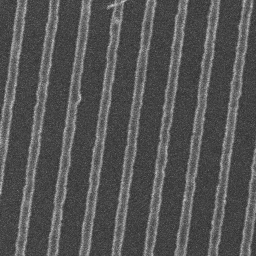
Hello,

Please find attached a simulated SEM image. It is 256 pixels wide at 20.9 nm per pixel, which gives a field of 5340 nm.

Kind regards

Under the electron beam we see parallel lines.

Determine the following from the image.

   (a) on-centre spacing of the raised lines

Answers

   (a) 666 nm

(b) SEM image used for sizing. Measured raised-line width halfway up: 0.181 um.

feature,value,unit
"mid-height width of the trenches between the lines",22.9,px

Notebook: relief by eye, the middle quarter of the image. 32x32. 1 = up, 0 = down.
00111000000110000011100000011000
00111000001100000011000000011000
00110000001100000011000000110000
00110000001100000011000000110000
00110000001100000011000000110000
00110000001100000011000000110000
01110000001100000011000000110000
00110000001100000011000001110000
01110000011100000110000001110000
01110000011100000110000001100000
01100000011000000110000001100000
01100000011000000110000001100000
01100000011000000110000001100000
01100000011000000110000001100000
11100000011000001110000001100000
11100000110000001100000001100000
11100000110000001100000011000000
11000000110000001100000011000000
11000000110000001100000011000000
11000000110000001100000011000000
11000000110000001100000011000000
11000001110000001100000011000000
10000001100000011100000111000000
10000001100000011100000111000001
10000001100000011000000111000001
10000001100000011000000110000001
10000001100000011000000110000001
10000001100000011000000110000001
10000011100000011000000110000001
10000011100000111000001110000001
00000011100000110000000110000011
00000011000000110000001100000011